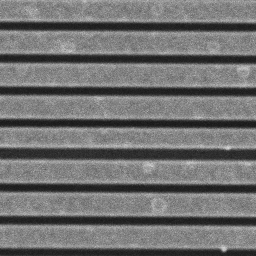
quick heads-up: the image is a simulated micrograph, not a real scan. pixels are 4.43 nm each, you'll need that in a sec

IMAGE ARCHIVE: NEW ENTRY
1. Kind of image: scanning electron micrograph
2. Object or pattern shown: parallel lines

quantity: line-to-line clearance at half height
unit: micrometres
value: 0.0382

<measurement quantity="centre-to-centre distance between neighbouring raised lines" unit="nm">143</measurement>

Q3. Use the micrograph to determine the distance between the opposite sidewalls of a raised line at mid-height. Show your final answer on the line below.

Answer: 101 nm